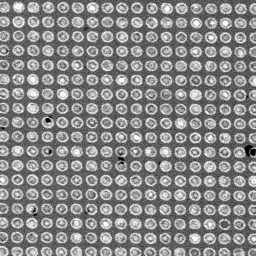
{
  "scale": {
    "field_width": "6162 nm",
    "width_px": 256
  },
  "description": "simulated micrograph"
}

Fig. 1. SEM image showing a regular array of holes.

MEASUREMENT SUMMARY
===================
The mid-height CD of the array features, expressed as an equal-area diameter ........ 234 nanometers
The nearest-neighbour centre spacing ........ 343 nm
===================